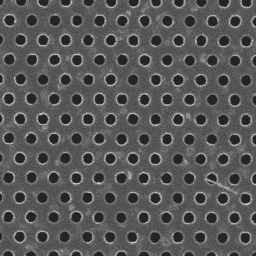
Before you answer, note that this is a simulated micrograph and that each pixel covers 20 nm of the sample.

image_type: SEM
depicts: a regular array of holes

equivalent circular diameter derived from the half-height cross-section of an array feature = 210 nanometres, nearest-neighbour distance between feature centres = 446 nanometers